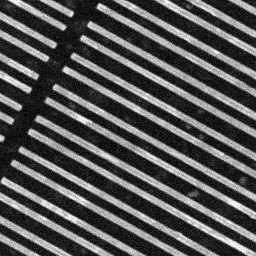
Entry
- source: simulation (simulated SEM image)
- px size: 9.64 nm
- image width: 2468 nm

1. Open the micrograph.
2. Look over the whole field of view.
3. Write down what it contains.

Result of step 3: parallel lines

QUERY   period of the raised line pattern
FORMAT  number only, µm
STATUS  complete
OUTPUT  0.171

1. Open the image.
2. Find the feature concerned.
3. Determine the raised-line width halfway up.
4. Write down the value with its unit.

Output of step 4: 5.57 pixels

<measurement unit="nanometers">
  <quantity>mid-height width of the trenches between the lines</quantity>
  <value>99.1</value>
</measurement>